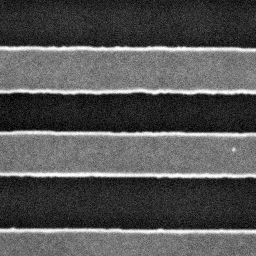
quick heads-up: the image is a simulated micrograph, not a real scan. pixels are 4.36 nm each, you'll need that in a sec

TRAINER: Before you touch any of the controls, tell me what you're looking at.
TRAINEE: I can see lines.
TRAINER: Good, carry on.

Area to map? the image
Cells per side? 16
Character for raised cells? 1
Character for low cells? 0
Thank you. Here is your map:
0000000000000000
0000000000000000
0000000000000000
1111111111111111
1111111111111111
1111111111111111
0000000000000000
0000000000000000
1111111111111111
1111111111111111
1111111111111111
0000000000000000
0000000000000000
0000000000000000
1111111111111111
1111111111111111